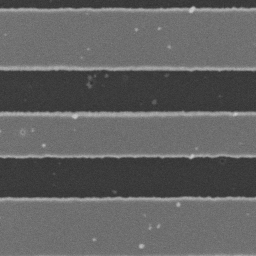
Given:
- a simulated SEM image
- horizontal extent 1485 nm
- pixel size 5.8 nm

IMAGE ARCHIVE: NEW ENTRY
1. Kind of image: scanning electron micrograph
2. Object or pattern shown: lines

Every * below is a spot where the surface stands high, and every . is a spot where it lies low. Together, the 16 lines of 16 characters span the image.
................
****************
****************
****************
................
................
................
****************
****************
****************
................
................
****************
****************
****************
****************